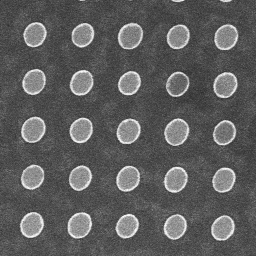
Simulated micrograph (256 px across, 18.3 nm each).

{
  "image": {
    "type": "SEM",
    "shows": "a regular array of raised bodies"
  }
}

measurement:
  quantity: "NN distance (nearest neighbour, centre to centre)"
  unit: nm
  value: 866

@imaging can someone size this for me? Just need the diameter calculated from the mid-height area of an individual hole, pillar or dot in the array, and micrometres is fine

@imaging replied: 0.42